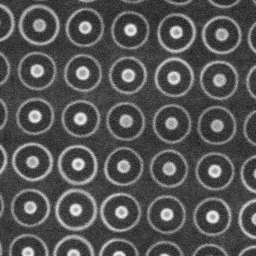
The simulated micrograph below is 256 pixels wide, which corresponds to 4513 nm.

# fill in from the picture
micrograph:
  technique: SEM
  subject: an array of small figures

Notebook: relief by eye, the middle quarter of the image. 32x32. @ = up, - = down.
@--------@@@--------@@@@-------@
@---@@---@@@--------@@@@--------
---@@@---@@@---@@---@@@----@----
----@----@@@---@@---@@@---@@@---
@-------@@@@--------@@@----@----
@@------@@@@@------@@@@---------
@@@@--@@@@@@@@----@@@@@@-------@
@@@@@@@@@@@@@@@@@@@@@@@@@@---@@@
@@@@@@@@@@@@@@@@@@@@@@@@@@@@@@@@
@@@---@@@@@@@@@@@@@@@@@@@@@@@@@@
@------@@@@@@----@@@@@@@@@--@@@@
--------@@@@-------@@@@@------@@
--------@@@--------@@@@--------@
---@@----@@---@@@---@@@--------@
---@@---@@@---@@@---@@----@@----
--------@@@----@----@@@---@@---@
@-------@@@@-------@@@@--------@
@@-----@@@@@-------@@@@@-------@
@@@@@@@@@@@@@@---@@@@@@@------@@
@@@@@@@@@@@@@@@@@@@@@@@@@@-@@@@@
@@@@@@@@@@@@@@@@@@@@@@@@@@@@@@@@
------@@@@@@@---@@@@@@@@@@@@@@@@
-------@@@@@------@@@@@@-----@@@
--------@@@--------@@@@-------@@
---@----@@@---@@---@@@--------@@
---@@---@@----@@---@@@---@@----@
--------@@----@@---@@@---@@@---@
--------@@@--------@@@--------@@
-------@@@@-------@@@@@-------@@
@@---@@@@@@@@----@@@@@@------@@@
@@@@@@@@@@@@@@@@@@@@@@@@@@-@@@@@
@@@@@@@@@@@@@@@@@@@@@@@@@@@@@@@@